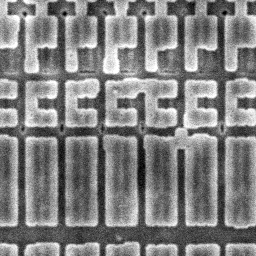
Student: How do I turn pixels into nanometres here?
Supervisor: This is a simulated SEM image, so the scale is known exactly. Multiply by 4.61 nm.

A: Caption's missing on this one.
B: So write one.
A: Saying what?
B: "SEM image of wiring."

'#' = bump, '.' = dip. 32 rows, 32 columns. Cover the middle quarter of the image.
.##.......####.......##.......##
.##.......####.......##........#
................................
................................
.########..#################...#
.########..#################..##
.########..#################..##
.#######...#######..########..##
.##........##........##........#
.##........##........##........#
.##........##........##........#
.#######...#######...#######...#
.#######...#######...#######..##
.#######...#######...#######..##
.#######...#######...#######..##
.####.................####....##
............................###.
............................###.
.#######..########..############
.#######..########..############
.#######..########..############
.#######..########..########..##
.#######...#######...#######...#
.#######...#######...#######...#
.#######...#######...#######...#
.#######...#######...#######...#
.#######...#######...#######...#
.#######...#######...#######...#
.#######...#######...#######..##
.#######...#######...#######..##
.#######...#######...#######..##
.#######...#######...#######..##